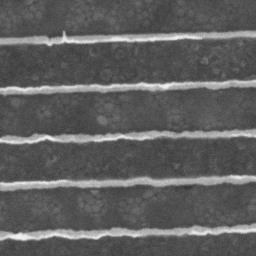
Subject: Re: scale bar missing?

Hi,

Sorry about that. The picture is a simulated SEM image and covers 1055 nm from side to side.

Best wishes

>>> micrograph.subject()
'one or a few lines or trenches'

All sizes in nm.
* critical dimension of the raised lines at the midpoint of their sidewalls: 201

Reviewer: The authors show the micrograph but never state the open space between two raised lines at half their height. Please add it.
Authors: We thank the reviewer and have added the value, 198 nm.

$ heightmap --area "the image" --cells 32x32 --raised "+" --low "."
................................
................................
................................
................................
......................+++.++++++
++++++++++++++++++++++++++++++++
++++++++++++++++++++++++++++++++
++++++++++++++++++++++++++++++++
++++++++++++++++++++++++++++++++
++++++++++++++++++++++++++++++++
+++++++++++++++++++++++++++++..+
................................
................................
................................
................................
................................
.............................+..
++.+++++++++++++++++++++++++++++
++++++++++++++++++++++++++++++++
++++++++++++++++++++++++++++++++
++++++++++++++++++++++++++++++++
++++++++++++++++++++++++++++++++
++++++++++++++++++++++++++++.+..
................................
................................
................................
................................
................................
................................
++++++++++++++++++++++++++++++++
++++++++++++++++++++++++++++++++
++++++++++++++++++++++++++++++++